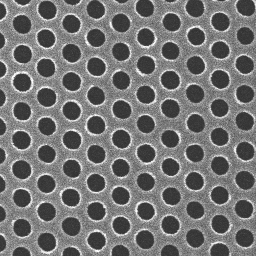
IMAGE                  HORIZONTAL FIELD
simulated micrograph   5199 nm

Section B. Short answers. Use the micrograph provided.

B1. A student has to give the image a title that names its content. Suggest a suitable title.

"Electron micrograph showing a regular array of holes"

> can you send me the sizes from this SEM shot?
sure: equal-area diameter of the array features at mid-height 0.373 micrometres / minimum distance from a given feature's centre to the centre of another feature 570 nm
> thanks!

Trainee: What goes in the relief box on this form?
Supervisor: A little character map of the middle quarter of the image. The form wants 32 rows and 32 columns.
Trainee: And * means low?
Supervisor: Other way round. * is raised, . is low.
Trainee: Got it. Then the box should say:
******.....*******.....********.
******....*********....********.
...****...***...****.****...****
....********....********.....***
....********.....*******.....***
....*********...****.****....**.
*..***....********....*********.
******....********.....*******..
******....********.....********.
*.*****...***...***...***...****
....********.....*******.....***
....********.....*******.....***
....********.....********....***
*...***..*****..***...*********.
******....********.....********.
******....********.....********.
******....****.****...****.*****
....****.***....*********...****
....********....********.....***
....********.....********....***
....***..****...***...***...***.
******....********.....*******..
******....********.....*******..
******....*********....********.
...****...**....****..***...****
....********....********.....***
....********....*********....***
....*********...***..****...***.
******....********....********..
******....********.....*******..
******....********....*********.
...****...**....****..***...****